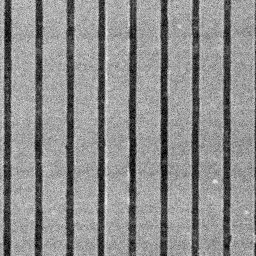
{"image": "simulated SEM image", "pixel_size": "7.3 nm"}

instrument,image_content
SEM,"parallel lines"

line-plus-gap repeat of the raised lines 31.4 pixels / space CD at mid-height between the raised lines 57.5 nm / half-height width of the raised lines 173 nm